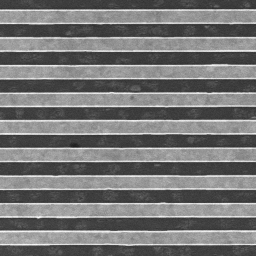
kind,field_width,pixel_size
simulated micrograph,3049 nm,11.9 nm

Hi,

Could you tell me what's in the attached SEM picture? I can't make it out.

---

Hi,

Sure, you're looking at parallel lines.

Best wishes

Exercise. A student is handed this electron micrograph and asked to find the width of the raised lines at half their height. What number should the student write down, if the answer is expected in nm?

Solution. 162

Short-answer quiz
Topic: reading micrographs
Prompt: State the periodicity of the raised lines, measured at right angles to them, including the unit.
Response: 329 nm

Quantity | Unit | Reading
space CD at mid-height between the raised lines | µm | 0.173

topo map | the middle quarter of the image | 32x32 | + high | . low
................................
++++++++++++++++++++++++++++++++
++++++++++++++++++++++++++++++++
+++++++++................+++....
................................
................................
................................
++++++++++++++++++++++++++++++++
++++++++++++++++++++++++++++++++
++++++++++++++++++++++++++++++++
++++++++++++++++++++++++++++++++
................................
................................
................................
++++++++++++++++++++++++++++++++
++++++++++++++++++++++++++++++++
++++++++++++++++++++++++++++++++
++..............................
................................
................................
................................
++++++++++++++++++++++++++++++++
++++++++++++++++++++++++++++++++
++++++++++++++++++++++++++++++++
................................
................................
................................
................................
++++++++++++++++++++++++++++++++
++++++++++++++++++++++++++++++++
++++++++++++++++++++++++++++++++
................................